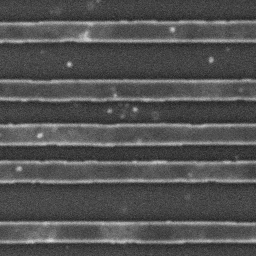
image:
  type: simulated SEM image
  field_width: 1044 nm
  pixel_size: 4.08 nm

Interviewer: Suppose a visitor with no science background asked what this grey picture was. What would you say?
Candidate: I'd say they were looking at lines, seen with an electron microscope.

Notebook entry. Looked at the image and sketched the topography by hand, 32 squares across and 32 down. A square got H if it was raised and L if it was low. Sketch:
LLLLLLLLLLLLLLLLLLLLLLLLLLLLLLLL
LLLLLLLLLLLLLLLLLLLLLLLLLLLLLLLL
LLLLLLLLLLLLLLLLLLLLLLLLLLLLLLLL
HHHHHHHHHHHHHHHHHHHHHHHHHHHHHHHH
HHHHHHHHHHHHHHHHHHHHHHHHHHHHHHHH
LLLLLLLLLLLLLLLLLLLLLLLLLLLLLLLL
LLLLLLLLLLLLLLLLLLLLLLLLLLLLLLLL
LLLLLLLLLLLLLLLLLLLLLLLLLLLLLLLL
LLLLLLLLLLLLLLLLLLLLLLLLLLLLLLLL
LLLLLLLLLLLLLLLLLLLLLLLLLLLLLLLL
HHHHHHHHHHHHHHHHHHHHHHHHHHHHHHHH
HHHHHHHHHHHHHHHHHHHHHHHHHHHHHHHH
LLHHLHHHHLLHHHLLLLHHHLLLLLLLLLLL
LLLLLLLLLLLLLLLLLLLLLLLLLLLLLLLL
LLLLLLLLLLLLLLLLLLLLLLLLLLLLLLLL
LLLLLLLLLLLLLLLLLLLLLLLLLLLLLLLL
HHHHHHHHHHHHHHHHHHHHHHHHHHHHHHHH
HHHHHHHHHHHHHHHHHHHHHHHHHHHHHHHH
LLLLLLLLLLLLLLLLLLLLLLLLLLLLLLLL
LLLLLLLLLLLLLLLLLLLLLLLLLLLLLLLL
HHHHHHHHHHHHHHHHHHHHHHHHHHHHHHHH
HHHHHHHHHHHHHHHHHHHHHHHHHHHHHHHH
HHHHHHHHHHHHHHHHHHHHHHHHHHHHHHHH
LLLLLLLLLLLLLLLLLLLLLLLLLLLLLLLL
LLLLLLLLLLLLLLLLLLLLLLLLLLLLLLLL
LLLLLLLLLLLLLLLLLLLLLLLLLLLLLLLL
LLLLLLLLLLLLLLLLLLLLLLLLLLLLLLLL
LLLLLLLLLLLLLLLLLLLLLLLLLLLLLLLL
HHHHHHHHHHHHHHHHHHHHHHHHHHHHHHHH
HHHHHHHHHHHHHHHHHHHHHHHHHHHHHHHH
LLLLLLLLLLLLLLLLLLLLLLLLLLLLLLLL
LLLLLLLLLLLLLLLLLLLLLLLLLLLLLLLL